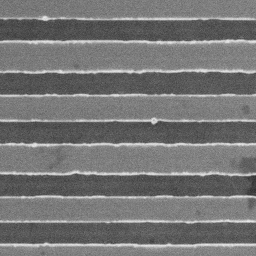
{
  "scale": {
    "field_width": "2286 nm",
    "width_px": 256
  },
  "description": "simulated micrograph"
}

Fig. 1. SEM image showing lines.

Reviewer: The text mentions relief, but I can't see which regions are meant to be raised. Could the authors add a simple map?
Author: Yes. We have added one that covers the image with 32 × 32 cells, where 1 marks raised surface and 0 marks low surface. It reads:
11111111111111111111111111111111
11111111111111111111111111111111
00000100000000000000000000000000
00000000000000000000000000000000
00000000000000000000000000000000
11111111111111111111111111111111
11111111111111111111111111111111
11111111111111111111111111111111
11111111111111111111111111111111
00000000000000000000000000000000
00000000000000000000000000000000
00000000000000000000000000000000
11111111111111111111111111111111
11111111111111111111111111111111
11111111111111111111111111111111
00000000000000000000000000000000
00000000000000000000000000000000
00000000000000000000000000000000
11111111111111111111111111111111
11111111111111111111111111111111
11111111111111111111111111111111
11111111111111111111111111111111
00000000000000000000000000000000
00000000000000000000000000000000
00000000000000000000000000000000
11111111111111111111111111111111
11111111111111111111111111111111
11111111111111111111111111111111
00000000000000000000000000000000
00000000000000000000000000000000
00000100000000000000000000000000
11111111111111111111111111111111